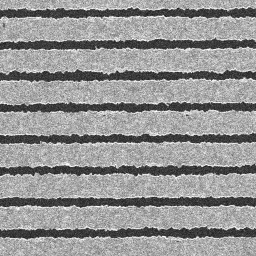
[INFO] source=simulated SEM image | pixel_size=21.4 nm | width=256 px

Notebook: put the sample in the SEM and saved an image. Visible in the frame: parallel lines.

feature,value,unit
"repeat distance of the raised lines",672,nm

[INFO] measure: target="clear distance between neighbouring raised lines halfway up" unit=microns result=0.187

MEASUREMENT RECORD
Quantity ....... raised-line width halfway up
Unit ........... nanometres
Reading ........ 460